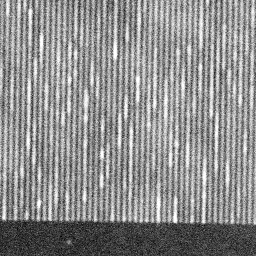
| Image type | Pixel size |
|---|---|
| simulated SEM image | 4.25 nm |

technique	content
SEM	parallel lines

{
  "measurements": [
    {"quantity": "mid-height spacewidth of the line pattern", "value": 13.3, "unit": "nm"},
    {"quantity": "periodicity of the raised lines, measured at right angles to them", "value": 24.3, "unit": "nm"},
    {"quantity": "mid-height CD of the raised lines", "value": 2.49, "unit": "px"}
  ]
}